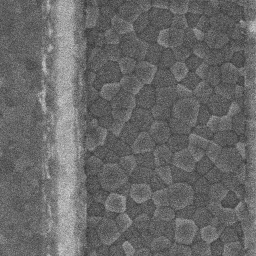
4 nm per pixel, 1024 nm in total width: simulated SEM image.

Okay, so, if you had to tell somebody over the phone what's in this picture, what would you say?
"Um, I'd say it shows one or a few lines or trenches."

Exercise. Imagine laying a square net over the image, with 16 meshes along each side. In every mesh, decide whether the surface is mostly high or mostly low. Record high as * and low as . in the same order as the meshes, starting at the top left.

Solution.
****............
****............
****............
****............
****............
****............
****............
****............
****............
****............
****............
****............
****............
****............
****............
****............